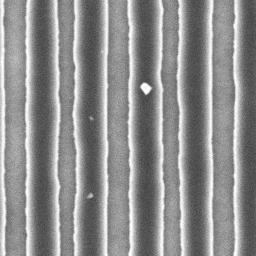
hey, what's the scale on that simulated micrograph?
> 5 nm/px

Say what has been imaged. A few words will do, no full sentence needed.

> lines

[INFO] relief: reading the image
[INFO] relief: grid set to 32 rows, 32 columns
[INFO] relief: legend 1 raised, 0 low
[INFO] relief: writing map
00011110011110001111001111100111
00011110011110001111001111000111
00011110011110001111000111000111
00011110011110001111000111000111
00011110011110001111000111000111
00011110011110001111000111000111
00011110011110001111001111000111
00011110011110001111001111000111
00011110011110001111001111000111
00011110011110001111001111000111
00011110011110001111001111000111
10011110011110001111001111000011
10011110011110001111001111000011
10011110011110001111001111000111
10011110011110001111000111000111
10011110011110001111000111000111
10011110011110001111001111000111
10011110011110001111001111000111
10011110001110001111000111000111
00011110001110001111001111000111
00011110001110001111001111100111
00001110001110001111000111100111
00011110001110001111000111100111
10011110001110001111000111100111
10011110011110001111000111000111
10011110011110001111000111000111
10011110011110001111000111000111
10011110011110001111000111100111
10011110011110001111000111100111
10001110011110001111000111100011
10011110011110001111000111000111
10011110011110001111000111100111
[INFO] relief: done